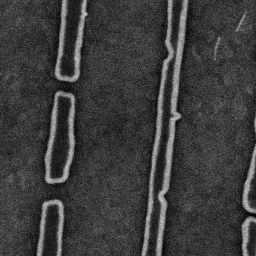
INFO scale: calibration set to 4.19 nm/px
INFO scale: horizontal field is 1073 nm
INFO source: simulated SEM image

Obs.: one or a few lines or trenches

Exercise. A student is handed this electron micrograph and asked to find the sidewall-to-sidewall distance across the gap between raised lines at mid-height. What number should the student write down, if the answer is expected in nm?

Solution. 356